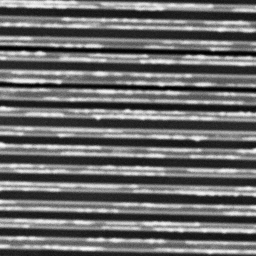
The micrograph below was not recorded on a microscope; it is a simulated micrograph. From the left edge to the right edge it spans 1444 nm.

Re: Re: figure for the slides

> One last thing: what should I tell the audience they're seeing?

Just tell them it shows parallel lines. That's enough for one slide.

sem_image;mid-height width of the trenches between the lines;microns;0.0578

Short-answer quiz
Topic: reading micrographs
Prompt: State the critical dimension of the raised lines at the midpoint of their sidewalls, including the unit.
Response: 48.6 nm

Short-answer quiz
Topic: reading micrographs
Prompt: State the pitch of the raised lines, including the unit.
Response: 104 nanometres